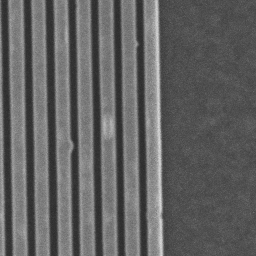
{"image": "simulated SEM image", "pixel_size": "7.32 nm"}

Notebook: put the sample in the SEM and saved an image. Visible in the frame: parallel lines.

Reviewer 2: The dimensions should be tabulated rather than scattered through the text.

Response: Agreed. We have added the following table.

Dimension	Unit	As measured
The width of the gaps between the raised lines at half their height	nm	68.7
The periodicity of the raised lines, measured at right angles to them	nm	164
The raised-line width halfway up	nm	98.9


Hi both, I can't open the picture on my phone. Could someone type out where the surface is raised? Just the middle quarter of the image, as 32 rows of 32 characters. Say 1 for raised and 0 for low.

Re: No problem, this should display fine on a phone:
10001110011100011100111100000000
10001110011100011100111100000000
10001110011100011100111100000000
10001110011100011100111100000000
10001110011100011100111000000000
10001110011100011100111000000000
10001110011100011100011000000000
10001110011100011100011000000000
10001110011100011100011000000000
10001110011100011100011100000000
10001110011110011100011100000000
10001110011110011100011100000000
10001110011110011100011100000000
10001110011110011100011100000000
10001110011110011100011100000000
10001110011110011100011100000000
10001110011110011100011100000000
10001110011110011100011100000000
10001110011110011100011100000000
11001110001110011100011100000000
11001110001110011100011100000000
11001110001110011100011100000000
10001110001110011100011100000000
11001110001110011100011100000000
10001110001110011100011100000000
10001110001110011100011100000000
10001110001110011100011100000000
10001110001110011100011100000000
11001110001110011100011100000000
11001110001110011100011100000000
11001110001110011100011100000000
10001110001110011100011100000000